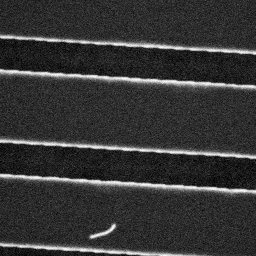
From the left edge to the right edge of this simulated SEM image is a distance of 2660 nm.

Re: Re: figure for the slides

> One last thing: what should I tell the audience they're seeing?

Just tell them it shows lines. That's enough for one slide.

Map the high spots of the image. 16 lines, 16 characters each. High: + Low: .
++++++++++++++++
++++++++++++++++
...+++++++++++++
................
++..............
++++++++++++++++
++++++++++++++++
++++++++++++++++
++++++++++++++++
..........++++++
................
++++++++++......
++++++++++++++++
++++++++++++++++
++++++++++++++++
...+++++++++++++